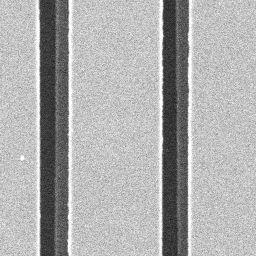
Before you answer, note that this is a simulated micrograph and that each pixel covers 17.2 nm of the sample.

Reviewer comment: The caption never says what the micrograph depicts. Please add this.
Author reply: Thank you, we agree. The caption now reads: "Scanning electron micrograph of lines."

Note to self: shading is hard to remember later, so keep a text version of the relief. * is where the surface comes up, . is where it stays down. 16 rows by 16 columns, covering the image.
**..******..****
**..******..****
**..******..****
**..******..****
**..******..****
**..******..****
**..******..****
**..******..****
**..******..****
**..******..****
**..******..****
**..******..****
**..******..****
**..******..****
**..******..****
**..******..****